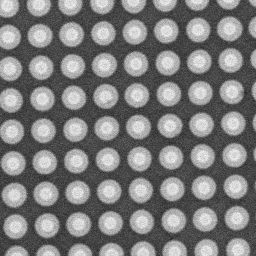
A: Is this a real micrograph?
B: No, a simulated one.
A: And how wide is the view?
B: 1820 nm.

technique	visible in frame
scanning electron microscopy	an array of small figures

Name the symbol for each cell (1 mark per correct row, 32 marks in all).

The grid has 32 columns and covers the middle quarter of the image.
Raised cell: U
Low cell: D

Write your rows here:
UUUUUDDUUUUUUDDUUUUUUDDUUUUUUDDU
UUUUUDDUUUUUUDDUUUUUUDDUUUUUDDDD
UUUUUDDDUUUUDDDDUUUUDDDDDUUDDDDD
DUUDDDDDDDDDDDDDDDDDDDDDDDDDDDDD
DDDDDDDDDDDDDDDDDDDDDDDDDDDDDDDD
DDDDDDDDDUUUDDDDUUUUDDDDUUUUDDDD
UUUUUDDDUUUUUDDDUUUUUDDUUUUUUDDU
UUUUUDDDUUUUUDDUUUUUUDDUUUUUUDDU
UUUUUDDUUUUUUDDUUUUUUDDUUUUUUDDU
UUUUUDDDUUUUUDDDUUUUUDDDUUUUDDDD
UUUUUDDDDUUUDDDDDUUUDDDDDDDDDDDD
DDDDDDDDDDDDDDDDDDDDDDDDDDDDDDDD
DDDDDDDDDDDDDDDDDDDDDDDDDDDDDDDD
DDUDDDDDDUUUDDDDDUUUUDDDUUUUUDDD
DUUUUDDDUUUUUDDDUUUUUDDDUUUUUDDU
UUUUUUDDUUUUUUDDUUUUUUDUUUUUUDDU
UUUUUUDDUUUUUUDDUUUUUUDDUUUUUDDD
UUUUUDDDUUUUUDDDUUUUUDDDUUUUUDDD
DUUUUDDDDUUUDDDDDUUUDDDDDDDDDDDD
DDDDDDDDDDDDDDDDDDDDDDDDDDDDDDDD
DDDDDDDDDDDDDDDDDDDDDDDDDDDDDDDD
DDUUDDDDDUUUUDDDDUUUUDDDUUUUUDDD
DUUUUUDDUUUUUDDDUUUUUUDDUUUUUUDD
UUUUUUDDUUUUUUDDUUUUUUDDUUUUUUDD
UUUUUUDDUUUUUUDDUUUUUUDDUUUUUDDD
UUUUUUDDUUUUUDDDDUUUUDDDDUUUUDDD
DUUUUDDDDDUUDDDDDDUUDDDDDDDDDDDD
DDDDDDDDDDDDDDDDDDDDDDDDDDDDDDDD
DDDDDDDDDDDDDDDDDDDDDDDDDDUUDDDD
DDUUUDDDDDUUUDDDDUUUUDDDDUUUUDDD
DUUUUUDDDUUUUUDDUUUUUUDDUUUUUUDD
UUUUUUDDUUUUUUDDUUUUUUDDUUUUUUDD